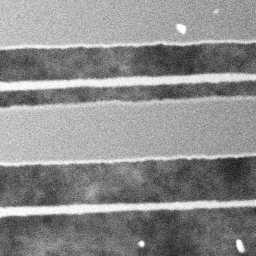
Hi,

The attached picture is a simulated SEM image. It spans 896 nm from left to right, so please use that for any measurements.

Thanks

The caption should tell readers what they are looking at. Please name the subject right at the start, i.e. lines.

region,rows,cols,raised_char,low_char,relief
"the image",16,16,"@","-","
@@@@@@@@@@@@@@@@
@@@@@@@@@@@@@@@@
@@@@@@@@@@@@@@@@
----------------
----------------
-@--------------
-----@@@@@@@@@@@
@@@@@@@@@@@@@@@@
@@@@@@@@@@@@@@@@
@@@@@@@@@@@@@@@@
----------------
----------------
----------------
----------------
----------------
----------------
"